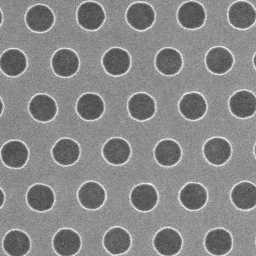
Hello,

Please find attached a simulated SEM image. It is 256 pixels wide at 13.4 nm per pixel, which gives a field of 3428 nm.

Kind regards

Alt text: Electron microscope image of a regular array of raised bodies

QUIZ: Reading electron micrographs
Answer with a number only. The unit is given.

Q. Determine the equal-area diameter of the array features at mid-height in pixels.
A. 29.2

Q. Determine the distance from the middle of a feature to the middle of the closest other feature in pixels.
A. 50.4